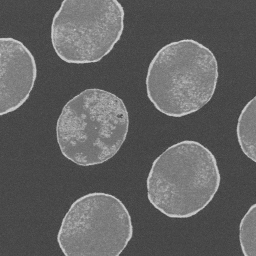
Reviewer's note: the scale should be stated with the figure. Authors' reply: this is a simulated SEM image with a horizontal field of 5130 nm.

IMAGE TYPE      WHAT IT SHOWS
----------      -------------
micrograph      raised bodies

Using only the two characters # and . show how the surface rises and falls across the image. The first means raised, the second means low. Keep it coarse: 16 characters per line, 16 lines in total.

....####........
...#####........
#..####.........
##..##....###...
##.......#####..
##.......####...
#.........###...
...............#
...............#
..........###..#
..........###...
.........#####..
.....##..####...
....####.......#
....####.......#
....####.......#